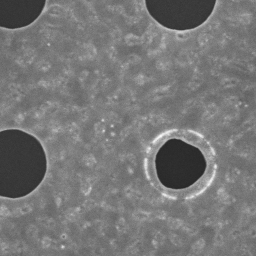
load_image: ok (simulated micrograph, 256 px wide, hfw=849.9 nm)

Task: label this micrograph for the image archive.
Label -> holes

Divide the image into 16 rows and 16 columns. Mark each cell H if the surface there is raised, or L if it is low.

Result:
LLLHHHHHHLLLLHHH
LLHHHHHHHHLLLHHH
HHHHHHHHHHHHHHHH
HHHHHHHHHHHHHHHH
HHHHHHHHHHHHHHHH
HHHHHHHHHHHHHHHH
HHHHHHHHHHHHHHHH
HHHHHHHHHHHHHHHH
LLHHHHHHHHHHHHHH
LLLHHHHHHHLLLHHH
LLLHHHHHHHLLLHHH
LLHHHHHHHHLLHHHH
HHHHHHHHHHHHHHHH
HHHHHHHHHHHHHHHH
HHHHHHHHHHHHHHHH
HHHHHHHHHHHHHHHH